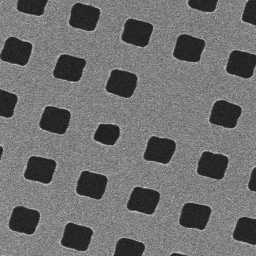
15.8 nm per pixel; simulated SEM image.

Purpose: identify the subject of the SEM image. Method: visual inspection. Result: a regular array of holes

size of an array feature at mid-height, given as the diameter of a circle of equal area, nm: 464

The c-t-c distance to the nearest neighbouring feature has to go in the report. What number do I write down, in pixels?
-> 52.9